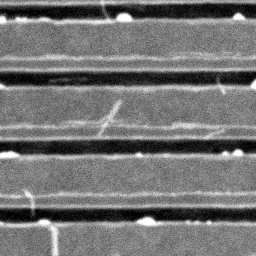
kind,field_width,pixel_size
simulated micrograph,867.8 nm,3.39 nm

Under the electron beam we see lines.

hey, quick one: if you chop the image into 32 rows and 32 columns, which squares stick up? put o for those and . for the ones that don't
............o...................
................................
o.ooooo......oooo........oooooo.
oooooooooooooooooooooooooooooooo
oooooooooooooooooooooooooooooooo
oooooooooooooooooooooooooooooooo
oooooooooooooooooooooooooooooooo
oooooooooooooooooooooooooooooooo
oooooooooooooooooooooooooooooooo
................................
...............................o
oooooooooooooooooooooooooooooooo
oooooooooooooooooooooooooooooooo
oooooooooooooooooooooooooooooooo
oooooooooooooooooooooooooooooooo
oooooooooooooooooooooooooooooooo
oooooooooooooooooooooooooooooooo
................................
................................
ooo..............ooooooooooooooo
oooooooooooooooooooooooooooooooo
oooooooooooooooooooooooooooooooo
oooooooooooooooooooooooooooooooo
oooooooooooooooooooooooooooooooo
oooooooooooooooooooooooooooooooo
oooooooooooooooooooooooooooooooo
................................
..................o.............
oooooooooooooooooooooooooooooooo
oooooooooooooooooooooooooooooooo
oooooooooooooooooooooooooooooooo
oooooooooooooooooooooooooooooooo